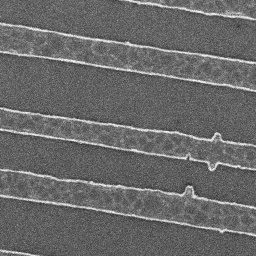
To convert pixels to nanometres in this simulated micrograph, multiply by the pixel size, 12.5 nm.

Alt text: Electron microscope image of one or a few lines or trenches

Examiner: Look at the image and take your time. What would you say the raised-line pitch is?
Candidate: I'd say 887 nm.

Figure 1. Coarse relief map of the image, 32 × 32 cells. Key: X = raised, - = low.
-------------------XXXXXXXXXXXXX
-------------------------XXXX-XX
--------------------------------
XXXX----------------------------
XXXXXXXXX-----------------------
XXXXXXXXXXXXXXXX----------------
XXXXXXXXXXXXXXXXXXXXXXX---------
--------XXXXXXXXXXXXXXXXXXXXXX--
--------------XXXXXXXXXXXXXXXXXX
---------------------XXXXXXXXXXX
---------------------------XXXXX
--------------------------------
--------------------------------
--------------------------------
XXXXXX--------------------------
XXXXX-XXXXXXXX------------------
--XXXXXXXXXXXXXXXXXXX-----------
---------XXXXXXXXXXXXXXXXXXX----
--------------XXXXXXXXXXXXXXXXXX
---------------------XXXXXXXXXXX
--------------------------X-XXXX
XXX-----------------------------
XXXXXXX-------------------------
XXXXXXXXXXXXXXXX-------X--------
XXXXXXXXXXXXXXXXXXXXXXXX--------
--------XXXXXXXXXXXXXXXXXXXXXX--
--------------XXXXXXXXXXXXXXXXXX
-------------------XXXXXXXXXXXXX
--------------------------XXXXXX
--------------------------------
--------------------------------
XX------------------------------